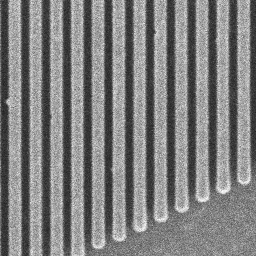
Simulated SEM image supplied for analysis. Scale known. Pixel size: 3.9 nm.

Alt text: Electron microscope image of parallel lines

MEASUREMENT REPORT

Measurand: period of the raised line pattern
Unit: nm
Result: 81.1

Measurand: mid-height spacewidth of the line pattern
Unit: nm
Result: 33.1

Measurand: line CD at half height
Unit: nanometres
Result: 47.8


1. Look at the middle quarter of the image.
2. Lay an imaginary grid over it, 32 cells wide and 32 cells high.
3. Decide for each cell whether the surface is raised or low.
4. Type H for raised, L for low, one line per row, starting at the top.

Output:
LLHHHLLHHHLLHHHLLLHHLLLHHHLLHHHL
LLHHHLLHHHLLHHHLLLHHLLLHHHLLHHHL
LLHHHLLHHHLLHHHLLLHHLLLHHHLLHHHL
LLHHHLLHHHLLHHHLLLHHLLLHHHLLHHHL
LLHHHLLHHHLLHHHLLLHHLLLHHHLLHHHL
LLHHHLLHHHLLHHHLLLHHLLLHHHLLHHHL
LLHHHLLHHHLLHHHLLLHHLLLHHHLLHHHL
LLHHHLLHHHLLHHHLLLHHLLLHHHLLHHHL
LLHHHLLHHHLLHHHLLLHHLLLHHHLLHHHL
LLHHHLLHHHLLHHHLLLHHLLLHHHLLHHHL
LLHHHLLHHHLLHHHLLLHHLLLHHHLLHHHL
LLHHHLLHHHLLHHHLLLHHLLLHHHLLHHHL
LLHHHLLHHHLLHHHLLLHHLLLHHHLLHHHL
LLHHHLLHHHLLHHHLLLHHLLLHHHLLHHHL
LLHHHLLHHHLLHHHLLLHHLLLHHHLLHHHL
LLHHHLLHHHLLHHHLLLHHLLLHHHLLHHHL
LLHHHLLHHHLLHHHLLLHHLLLHHHLLHHHL
LLHHHLLHHHLLHHHLLHHHLLLHHHLLHHHL
LLHHHLLHHHLLHHHLLHHHLLLHHHLLHHHL
LLHHHLLHHHLLHHHLLHHHLLLHHHLLHHHL
LLHHHLLHHHLLHHHLLHHHLLLHHHLLHHHL
LLHHHLLHHHLLHHHLLHHHLLLHHHLLHHHL
LLHHHLLHHHLLHHHLLHHHLLLHHHLLHHHL
LLHHHLLHHHLLHHHLLLHHLLLHHHLLHHHL
LLHHHLLHHHLLHHHLLLHHLLLHHHLLHHHL
LLHHHLLHHHLLHHHLLLHHLLLHHHLLHHHL
LLHHHLLHHHLLHHHLLLHHLLLHHHLLHHHL
LLHHHLLHHHLLHHHLLLHHLLLHHHLLHHHL
LLHHHLLHHHLLHHHLLLHHLLLHHHLLHHHL
LLHHHLLHHHLLHHHLLLHHLLLHHHLLHHHL
LLHHHLLHHHLLHHHLLLHHLLLHHHLLHHHL
LLHHHLLHHHLLHHHLLLHHLLLHHHLLHHHL